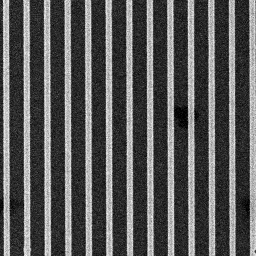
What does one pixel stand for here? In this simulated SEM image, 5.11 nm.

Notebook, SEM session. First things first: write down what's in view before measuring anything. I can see parallel lines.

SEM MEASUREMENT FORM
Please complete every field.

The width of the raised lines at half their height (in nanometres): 30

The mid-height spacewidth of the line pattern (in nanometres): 77.2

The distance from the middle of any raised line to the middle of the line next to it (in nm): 105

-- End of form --